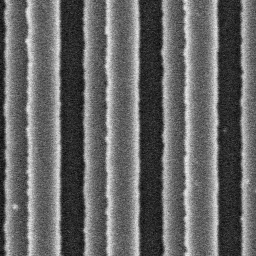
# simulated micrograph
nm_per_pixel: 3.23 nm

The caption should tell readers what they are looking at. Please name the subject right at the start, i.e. lines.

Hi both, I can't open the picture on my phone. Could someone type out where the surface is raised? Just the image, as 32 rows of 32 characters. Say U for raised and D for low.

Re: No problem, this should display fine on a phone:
DUUUUUUDDDDUUUUUUDDDUUUUUUUDDDUU
DUUUUUUDDDDUUUUUUDDDUUUUUUUDDDUU
DUUUUUUDDDDUUUUUUDDDUUUUUUUDDDUU
DUUUUUUDDDDUUUUUUDDDUUUUUUUDDDUU
DUUUUUUDDDDUUUUUUDDDUUUUUUUDDDUU
DUUUUUUDDDDUUUUUUDDDUUUUUUUDDDUU
DUUUUUUDDDDUUUUUUDDDUUUUUUUDDDUU
DUUUUUUDDDDUUUUUUDDDUUUUUUUDDDUU
DUUUUUUDDDDUUUUUUDDDUUUUUUUDDDUU
DUUUUUUDDDDUUUUUUDDDUUUUUUUDDDUU
DUUUUUUDDDDUUUUUUDDDUUUUUUUDDDUU
DUUUUUUDDDDUUUUUUDDDUUUUUUUDDDUU
DUUUUUUDDDDUUUUUUDDDUUUUUUUDDDUU
DUUUUUUDDDDUUUUUUDDDUUUUUUUDDDUU
DUUUUUUDDDDUUUUUUDDDDUUUUUUDDDUU
DUUUUUUDDDDUUUUUUDDDDUUUUUUDDDUU
DUUUUUUDDDDUUUUUUDDDUUUUUUUDDDUU
DUUUUUUDDDDUUUUUUDDDUUUUUUUDDDUU
DUUUUUUDDDDUUUUUUDDDDUUUUUUDDDUU
DUUUUUUDDDDUUUUUUDDDUUUUUUUDDDUU
DUUUUUUDDDDUUUUUUDDDUUUUUUUDDDUU
DUUUUUUDDDDUUUUUUDDDUUUUUUUDDDUU
DUUUUUUDDDDUUUUUUDDDUUUUUUUDDDUU
DUUUUUUDDDDUUUUUUDDDUUUUUUUDDDUU
DUUUUUUDDDDUUUUUUDDDUUUUUUUDDDUU
DUUUUUUDDDDUUUUUUDDDUUUUUUUDDDUU
DUUUUUUDDDDUUUUUUDDDUUUUUUUDDDUU
DUUUUUUDDDDUUUUUUDDDUUUUUUUDDDUU
DUUUUUUDDDDUUUUUUDDDUUUUUUUDDDUU
DUUUUUUDDDDUUUUUUDDDUUUUUUUDDDUU
DUUUUUUDDDDUUUUUUDDDDUUUUUUDDDUU
DUUUUUUDDDDUUUUUUDDDDUUUUUUDDDUU